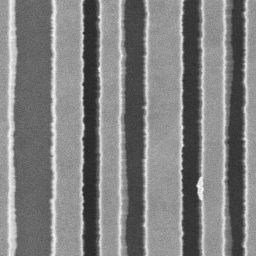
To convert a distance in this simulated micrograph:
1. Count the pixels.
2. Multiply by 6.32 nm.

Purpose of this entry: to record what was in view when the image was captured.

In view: lines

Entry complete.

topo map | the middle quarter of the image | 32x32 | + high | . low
+++++....++++++......+++++++++..
+++++....++++++......+++++++++..
+++++....++++++......+++++++++..
+++++....+++++.......++++++++...
+++++....+++++.......++++++++...
+++++....+++++.......++++++++...
+++++....++++++......+++++++++..
+++++....++++++......++++++++...
+++++....++++++......++++++++...
+++++....++++++......++++++++...
+++++....+++++......++++++++++..
+++++....++++++......+++++++++..
+++++....++++++......++++++++...
+++++....+++++......+++++++++...
+++++....+++++.......++++++++...
+++++....+++++.......+++++++++..
+++++....+++++......++++++++++..
+++++....++++++......++++++++...
+++++....++++++......+++++++++..
+++++....++++++......+++++++++..
+++++....+++++.......+++++++++..
+++++....++++++......++++++++...
+++++....++++++......++++++++...
+++++....++++++.....+++++++++...
+++++....++++++.....+++++++++...
+++++....++++++.....+++++++++...
+++++....++++++.....+++++++++...
+++++....+++++......+++++++++...
+++++....++++++.....+++++++++...
+++++....++++++......++++++++...
+++++....++++++.....+++++++++...
++++.....++++++......++++++++...